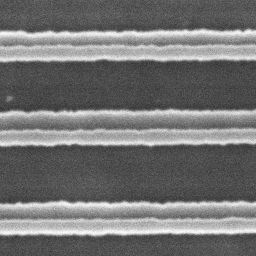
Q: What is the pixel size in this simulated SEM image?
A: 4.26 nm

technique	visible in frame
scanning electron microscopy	lines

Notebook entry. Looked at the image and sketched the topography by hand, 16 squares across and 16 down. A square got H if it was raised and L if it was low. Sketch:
LLLLLLLLLLLLLLLL
LLLLLLLLLLLLLLLL
HHHHHHHHHHHHHHHH
HHHHHHHHHHHHHHHH
LLLLLLLLLLLLLLLL
LLLLLLLLLLLLLLLL
LLLLLLLLLLLLLLLL
HHHHHHHHHHHHHHHH
HHHHHHHHHHHHHHHH
LLLLLLLLLLLLLLLL
LLLLLLLLLLLLLLLL
LLLLLLLLLLLLLLLL
LLLLLLLLLLLLLLLL
HHHHHHHHHHHHHHHH
HHHHHHHHHHHHHHHL
LLLLLLLLLLLLLLLL